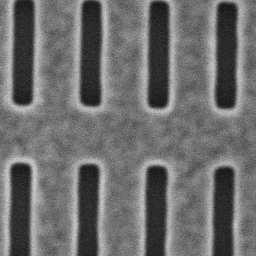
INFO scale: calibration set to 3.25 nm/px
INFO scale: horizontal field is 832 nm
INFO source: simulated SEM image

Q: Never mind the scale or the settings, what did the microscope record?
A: groups of lines, slits or small figures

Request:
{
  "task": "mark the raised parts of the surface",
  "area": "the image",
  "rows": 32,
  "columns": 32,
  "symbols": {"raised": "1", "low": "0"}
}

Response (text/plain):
11000111110001111110011111100011
10000111110001111100011111100011
10000111110001111100011111100011
10000111110001111100011111100011
10000111110001111100011111100011
10000111110001111100011111100011
10000111110001111100011111100011
10001111110001111100011111100011
10001111110001111100011111100011
10001111110001111100011111100011
10001111110001111100011111100011
10001111110001111100011111100011
10001111110001111100011111100011
11111111111011111110011111100111
11111111111111111111111111111111
11111111111111111111111111111111
11111111111111111111111111111111
11111111111111111111111111111111
11111111111111111111111111111111
11111111111111111111111111111111
10001111110011111110111111111111
10001111110001111100011111100111
10001111110001111100011111000111
10001111110001111100011111000111
10001111110001111100011111000111
10001111110001111100011111000111
10001111110011111100011111000111
10001111110011111100011111000111
10001111110011111100011111000111
10001111110011111100011111000111
10001111100011111100011111000111
10001111100011111100011111000111